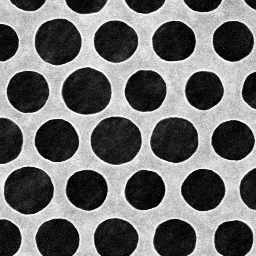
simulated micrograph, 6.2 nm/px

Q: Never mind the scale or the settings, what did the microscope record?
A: a regular array of holes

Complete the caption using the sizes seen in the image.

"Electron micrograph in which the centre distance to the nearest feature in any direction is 0.354 µm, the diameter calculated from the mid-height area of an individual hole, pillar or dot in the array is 0.265 um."